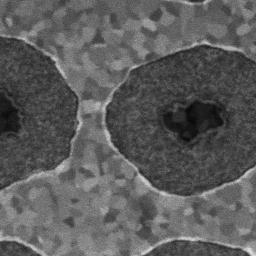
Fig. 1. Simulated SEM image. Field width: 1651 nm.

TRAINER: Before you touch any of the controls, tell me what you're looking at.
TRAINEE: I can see ring-shaped grooves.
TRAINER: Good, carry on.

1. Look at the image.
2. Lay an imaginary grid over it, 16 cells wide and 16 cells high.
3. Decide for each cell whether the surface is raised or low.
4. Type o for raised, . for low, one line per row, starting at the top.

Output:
oooooooooooooooo
oooooooooooooooo
.ooooooooooooooo
...ooooooo.....o
....oooo........
....ooo.........
o....oo....ooo..
o....oo...oooo..
.....oo....oo...
....ooo.........
...ooooo........
.oooooooo.....oo
oooooooooooooooo
oooooooooooooooo
oooooooooooooooo
..oooooooo.....o